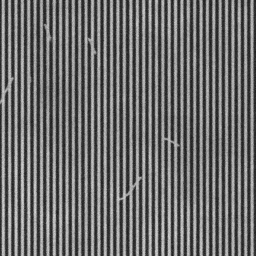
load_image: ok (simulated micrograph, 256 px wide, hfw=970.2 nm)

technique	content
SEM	parallel lines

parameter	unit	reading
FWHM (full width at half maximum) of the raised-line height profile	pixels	2.74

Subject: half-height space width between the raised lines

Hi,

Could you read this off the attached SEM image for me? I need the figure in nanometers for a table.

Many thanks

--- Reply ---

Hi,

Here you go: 13.7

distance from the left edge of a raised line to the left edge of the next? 24.1 nanometres